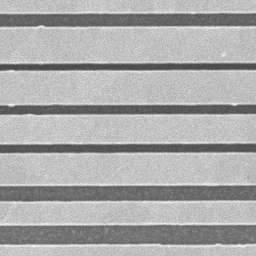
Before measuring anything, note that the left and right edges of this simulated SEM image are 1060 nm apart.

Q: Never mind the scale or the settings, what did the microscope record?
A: parallel lines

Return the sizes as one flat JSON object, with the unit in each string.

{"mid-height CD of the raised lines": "131 nm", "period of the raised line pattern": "174 nanometres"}